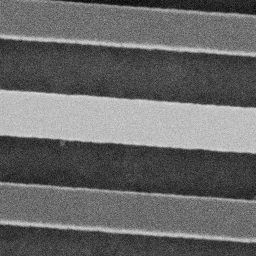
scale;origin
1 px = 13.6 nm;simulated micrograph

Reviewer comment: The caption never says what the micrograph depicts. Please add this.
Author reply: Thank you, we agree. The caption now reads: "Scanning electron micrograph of lines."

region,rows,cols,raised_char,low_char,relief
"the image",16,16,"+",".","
+++++++++.......
++++++++++++++++
..++++++++++++++
................
................
................
++++++++++++....
++++++++++++++++
.+++++++++++++++
...............+
................
+...............
+++++++++++++++.
++++++++++++++++
.......+++++++++
................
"